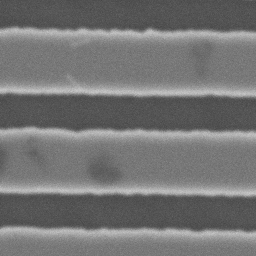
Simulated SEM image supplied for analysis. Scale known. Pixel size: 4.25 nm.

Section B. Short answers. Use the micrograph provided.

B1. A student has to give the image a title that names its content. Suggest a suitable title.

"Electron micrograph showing lines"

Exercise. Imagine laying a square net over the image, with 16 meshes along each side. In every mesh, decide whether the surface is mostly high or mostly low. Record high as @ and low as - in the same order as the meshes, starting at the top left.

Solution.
----------------
----------------
@@@@@@@@@@@@@@@@
@@@@@@@@@@@@@@@@
@@@@@@@@@@@@@@@@
@@@@@@@@@@@@@@@@
----------------
----------------
@@@@@@@@@@@@@@@@
@@@@@@@@@@@@@@@@
@@@@@@@@@@@@@@@@
@@@@@@@@@@@@@@@@
----------------
----------------
@@@@@@@@@@@@@@@-
@@@@@@@@@@@@@@@@